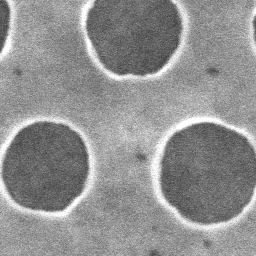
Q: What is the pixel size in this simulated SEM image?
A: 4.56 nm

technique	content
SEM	holes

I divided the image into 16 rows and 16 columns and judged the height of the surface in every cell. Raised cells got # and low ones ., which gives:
.#####.....#####
.####......#####
######.....#####
######.....#####
#######...######
################
################
################
#....######....#
.....#####......
......####......
.....#####......
#....#####......
###########....#
################
################